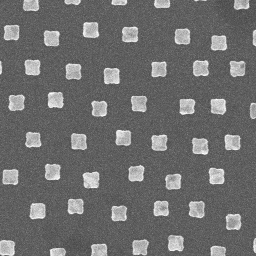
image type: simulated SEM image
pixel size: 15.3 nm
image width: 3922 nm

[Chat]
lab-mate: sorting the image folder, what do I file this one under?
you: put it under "a regular array of raised bodies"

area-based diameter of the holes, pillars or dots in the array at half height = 16.1 pixels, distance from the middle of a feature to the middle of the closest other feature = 0.548 micrometres